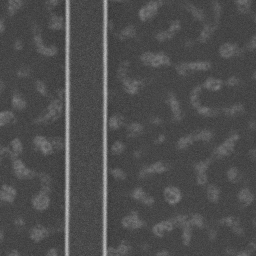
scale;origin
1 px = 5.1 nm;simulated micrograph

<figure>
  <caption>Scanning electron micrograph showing one or a few lines or trenches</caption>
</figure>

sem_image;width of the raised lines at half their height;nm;198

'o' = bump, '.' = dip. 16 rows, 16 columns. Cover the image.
....ooo.........
....ooo.........
....ooo.........
....ooo.........
....ooo.........
....ooo.........
....ooo.........
....ooo.........
....ooo.........
....ooo.........
....ooo.........
....ooo.........
....ooo.........
....ooo.........
....ooo.........
....ooo.........